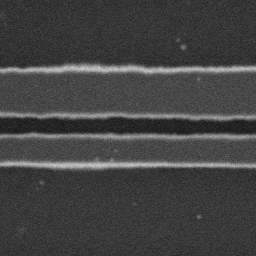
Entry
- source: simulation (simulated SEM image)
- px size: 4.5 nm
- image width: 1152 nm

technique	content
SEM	lines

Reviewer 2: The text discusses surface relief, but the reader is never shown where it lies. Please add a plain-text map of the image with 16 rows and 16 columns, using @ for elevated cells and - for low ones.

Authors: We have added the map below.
----------------
----------------
----------------
----------------
@@@@@@@@@@@@@@@@
@@@@@@@@@@@@@@@@
@@@@@@@@@@@@@@@@
@@@@@@@@@@@@@@@@
@@@@@@@@@@@@@@@@
@@@@@@@@@@@@@@@@
----------------
----------------
----------------
----------------
----------------
----------------